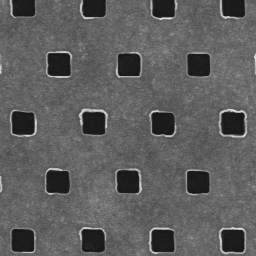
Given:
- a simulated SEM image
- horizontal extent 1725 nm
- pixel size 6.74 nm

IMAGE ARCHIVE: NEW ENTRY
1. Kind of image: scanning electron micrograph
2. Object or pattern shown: a regular array of holes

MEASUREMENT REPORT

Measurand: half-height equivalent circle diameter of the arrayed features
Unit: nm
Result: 171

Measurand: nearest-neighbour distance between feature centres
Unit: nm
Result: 458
